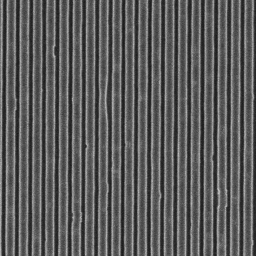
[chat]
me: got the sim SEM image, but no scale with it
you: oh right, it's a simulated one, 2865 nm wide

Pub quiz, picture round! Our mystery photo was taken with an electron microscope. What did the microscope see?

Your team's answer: parallel lines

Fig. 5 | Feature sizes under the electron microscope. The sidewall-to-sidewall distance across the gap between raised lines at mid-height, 0.0518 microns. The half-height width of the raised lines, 93.7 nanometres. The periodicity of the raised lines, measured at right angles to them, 13.2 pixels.